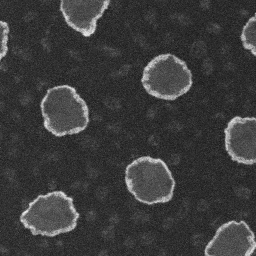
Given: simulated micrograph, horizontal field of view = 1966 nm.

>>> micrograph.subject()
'raised bodies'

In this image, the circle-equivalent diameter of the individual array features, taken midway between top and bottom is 362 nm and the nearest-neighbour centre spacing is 804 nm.